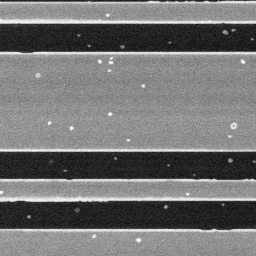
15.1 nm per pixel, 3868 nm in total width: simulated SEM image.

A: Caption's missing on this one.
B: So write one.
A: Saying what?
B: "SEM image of lines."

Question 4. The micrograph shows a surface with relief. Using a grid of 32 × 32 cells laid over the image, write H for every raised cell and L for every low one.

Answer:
HHHHHHHHHHHHHHHHHHHHHHHHHHHHHHHH
HHHHHHHHHHHHHHHHHHHHHHHHHHHHHHHH
HHHHHHHHHHHHHHHHHHHHHHHHHHHHHHHH
LLLLLLLLLLLLLLLLLLLLLLLLLLLLLLLL
LLLLLLLLLLLLLLLLLLLLLLLLLLLLLLLL
LLLLLLLLLLLLLLLLLLLLLLLLLLLLLLLL
LLLLLLLLLLLLLLLLLLLLLLLLLLLLLLLL
HHHHHHHHHHHHHHHHHHHHHHHHHHHHHHHH
HHHHHHHHHHHHHHHHHHHHHHHHHHHHHHHH
HHHHHHHHHHHHHHHHHHHHHHHHHHHHHHHH
HHHHHHHHHHHHHHHHHHHHHHHHHHHHHHHH
HHHHHHHHHHHHHHHHHHHHHHHHHHHHHHHH
HHHHHHHHHHHHHHHHHHHHHHHHHHHHHHHH
HHHHHHHHHHHHHHHHHHHHHHHHHHHHHHHH
HHHHHHHHHHHHHHHHHHHHHHHHHHHHHHHH
HHHHHHHHHHHHHHHHHHHHHHHHHHHHHHHH
HHHHHHHHHHHHHHHHHHHHHHHHHHHHHHHH
HHHHHHHHHHHHHHHHHHHHHHHHHHHHHHHH
HHHHHHHHHHHHHHHHHHHHHHHHHHHHHHHH
LLLLLLLLLLLLLLLLLLLLLLLLLLLLLLLL
LLLLLLLLLLLLLLLLLLLLLLLLLLLLLLLL
LLLLLLLLLLLLLLLLLLLLLLLLLLLLLLLL
HHHHHHHHHHHHHHHHHHHHHHHHHHHLLLHH
HHHHHHHHHHHHHHHHHHHHHHHHHHHHHHHH
HHHHHHHHHHHHHHHHHHHHHHHHHHHHHHHH
LLLLLLLLLLLLLLLLLLLLLLLLLLLLLLLL
LLLLLLLLLLLLLLLLLLLLLLLLLLLLLLLL
LLLLLLLLLLLLLLLLLLLLLLLLLLLLLLLL
LLLLLLLLLLLLLLLLLLLLLLLLLLLLLLLL
HHHHHHHHHHHHHHHHHHHHHHHHHHHHHHHH
HHHHHHHHHHHHHHHHHHHHHHHHHHHHHHHH
HHHHHHHHHHHHHHHHHHHHHHHHHHHHHHHH